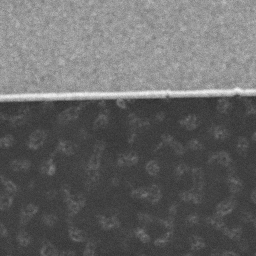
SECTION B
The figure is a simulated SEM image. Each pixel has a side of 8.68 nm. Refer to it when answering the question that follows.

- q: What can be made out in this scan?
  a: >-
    one or a few lines or trenches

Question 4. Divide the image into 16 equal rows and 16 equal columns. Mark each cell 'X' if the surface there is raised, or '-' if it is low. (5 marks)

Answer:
XXXXXXXXXXXXXXXX
XXXXXXXXXXXXXXXX
XXXXXXXXXXXXXXXX
XXXXXXXXXXXXXXXX
XXXXXXXXXXXXXXXX
XXXXXXXXXXXXXXXX
----------------
----------------
----------------
----------------
----------------
----------------
----------------
----------------
----------------
----------------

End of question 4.